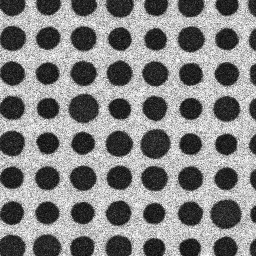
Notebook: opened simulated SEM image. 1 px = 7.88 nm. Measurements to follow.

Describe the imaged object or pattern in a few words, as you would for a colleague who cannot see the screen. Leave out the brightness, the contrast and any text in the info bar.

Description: a regular array of holes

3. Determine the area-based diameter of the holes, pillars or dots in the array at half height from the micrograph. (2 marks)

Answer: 190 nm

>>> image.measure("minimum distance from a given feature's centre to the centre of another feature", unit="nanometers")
273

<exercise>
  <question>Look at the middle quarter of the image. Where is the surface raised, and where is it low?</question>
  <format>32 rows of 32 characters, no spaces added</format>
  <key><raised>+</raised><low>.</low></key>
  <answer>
++.....++++......+++.....++++...
++......+++......+++......+++...
+.......+++......++.......+++...
++......+++......+++......+++...
+++....++++.....++++.....++++...
++++.++++++++..+++++++.+++++++++
++++++++++++++++++++++++++++++++
++++.+++++++++++++++++++++++++++
++......+++++++++++++...+++++++.
+........++.....++++.....+++++..
+........++.....++++......+++...
+........++......+++......+++...
+........++.....++++.....++++...
++......++++....+++++....+++++..
++++..++++++++++++++++++++++++++
++++++++++++++++++++++++++++++++
+++++++++++++++++++++....+++++++
+++...++++++....++++......+++++.
++.....++++......++........++...
++......++.......++........++...
++......++.......++........++...
++.....++++......++.......+++...
+++...++++++....++++.....+++++..
+++++++++++++++++++++...++++++++
++++++++++++++++++++++++++++++++
++++..+++++++.++++++++.+++++++++
++.....++++.....++++.....+++++..
++......+++......+++......+++...
+.......+++......++.......++....
++......+++......+++......+++...
++......+++.....++++.....++++...
++++..+++++++..++++++...+++++++.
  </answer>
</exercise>